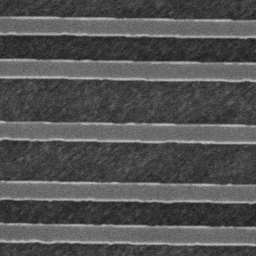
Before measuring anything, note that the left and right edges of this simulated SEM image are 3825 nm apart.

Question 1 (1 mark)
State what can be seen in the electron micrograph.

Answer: lines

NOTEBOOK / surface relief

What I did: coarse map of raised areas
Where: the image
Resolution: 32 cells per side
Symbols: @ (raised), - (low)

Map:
--------------------------------
--------------------------------
@@@@@@@@@@@@@@@@@@@@@@----------
@@@@@@@@@@@@@@@@@@@@@@@@@@@@@@@@
-------------------@@@@@@@@@@@@@
--------------------------------
--------------------------------
@@@@@---------------------------
@@@@@@@@@@@@@@@@@@@@@@@@@@@@@@@@
@@@@@@@@@@@@@@@@@@@@@@@@@@@@@@@@
--------------------------------
--------------------------------
--------------------------------
--------------------------------
--------------------------------
@@@@@@@@@@@@@@--@---------------
@@@@@@@@@@@@@@@@@@@@@@@@@@@@@@@@
--------@-@@@@@@@@@@@@@@@@@@@@@@
--------------------------------
--------------------------------
--------------------------------
--------------------------------
--------------------------------
@@@@@@@@@@@@@@@@@@@@@@@@@@@@@@@@
@@@@@@@@@@@@@@@@@@@@@@@@@@@@@@@@
--------------------------------
--------------------------------
--------------------------------
@@@@@@@@@@@@@@@@@@@@@@@@@@@@@@@@
@@@@@@@@@@@@@@@@@@@@@@@@@@@@@@@@
---------------------@@@-@@@@@@@
--------------------------------